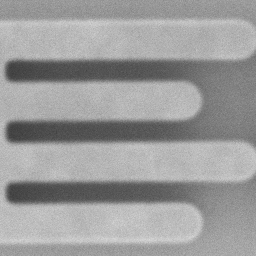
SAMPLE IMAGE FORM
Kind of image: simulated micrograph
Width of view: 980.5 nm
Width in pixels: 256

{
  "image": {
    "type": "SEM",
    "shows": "groups of lines, slits or small figures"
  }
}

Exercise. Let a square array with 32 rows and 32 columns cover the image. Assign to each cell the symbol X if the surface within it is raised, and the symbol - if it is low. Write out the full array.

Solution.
--------------------------------
--------------------------------
--------------------------------
XXXXXXXXXXXXXXXXXXXXXXXXXXXXXXXX
XXXXXXXXXXXXXXXXXXXXXXXXXXXXXXXX
XXXXXXXXXXXXXXXXXXXXXXXXXXXXXXXX
XXXXXXXXXXXXXXXXXXXXXXXXXXXXXXXX
X-------------------------------
X-------------------------------
X-------------------------------
XXXXXXXXXXXXXXXXXXXXXXXX--------
XXXXXXXXXXXXXXXXXXXXXXXXX-------
XXXXXXXXXXXXXXXXXXXXXXXXX-------
XXXXXXXXXXXXXXXXXXXXXXXXX-------
XXXXXXXXXXXXXXXXXXXXXXXX--------
X-------------------------------
X-------------------------------
X-------------------------------
XXXXXXXXXXXXXXXXXXXXXXXXXXXXXXXX
XXXXXXXXXXXXXXXXXXXXXXXXXXXXXXXX
XXXXXXXXXXXXXXXXXXXXXXXXXXXXXXXX
XXXXXXXXXXXXXXXXXXXXXXXXXXXXXXXX
XXXXXXXXXXXXXXXXXXXXXXXXXXXXXX--
X-------------------------------
X-------------------------------
XX-----------------XXXX---------
XXXXXXXXXXXXXXXXXXXXXXXXX-------
XXXXXXXXXXXXXXXXXXXXXXXXX-------
XXXXXXXXXXXXXXXXXXXXXXXXX-------
XXXXXXXXXXXXXXXXXXXXXXXX--------
--------------------------------
--------------------------------